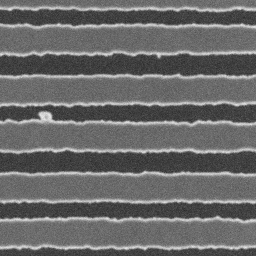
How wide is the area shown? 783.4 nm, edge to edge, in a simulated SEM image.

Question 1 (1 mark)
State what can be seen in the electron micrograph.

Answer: lines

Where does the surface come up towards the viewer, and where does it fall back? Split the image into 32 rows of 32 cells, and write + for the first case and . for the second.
++++++++++++++++++++++++++++++++
................................
................................
++++++++++++++++++++++++++++++++
++++++++++++++++++++++++++++++++
++++++++++++++++++++++++++++++++
++++++++++++++++++++++++++++++++
................................
................................
+.++++...++++++++.+++++.++.+...+
++++++++++++++++++++++++++++++++
++++++++++++++++++++++++++++++++
++++++++++++++++++++++++++++++++
................................
.....+..........................
++++++++++++++++++++++++++++++++
++++++++++++++++++++++++++++++++
++++++++++++++++++++++++++++++++
++++++++++++++++++++++++++++++++
................................
................................
..................+.............
++++++++++++++++++++++++++++++++
++++++++++++++++++++++++++++++++
++++++++++++++++++++++++++++++++
................................
................................
++++++++++++++++++++++++++++++.+
++++++++++++++++++++++++++++++++
++++++++++++++++++++++++++++++++
++++++++++++++++++++++++++++++++
................................